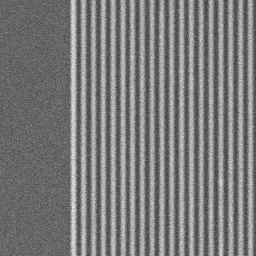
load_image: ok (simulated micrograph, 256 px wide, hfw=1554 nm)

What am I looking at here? parallel lines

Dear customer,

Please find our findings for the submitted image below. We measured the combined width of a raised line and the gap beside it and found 59.5 nanometres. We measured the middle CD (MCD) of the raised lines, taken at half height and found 21.2 nanometers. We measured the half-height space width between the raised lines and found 37.2 nm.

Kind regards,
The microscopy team